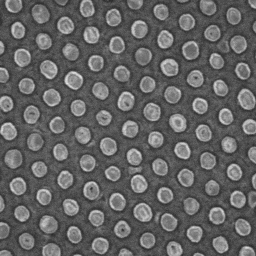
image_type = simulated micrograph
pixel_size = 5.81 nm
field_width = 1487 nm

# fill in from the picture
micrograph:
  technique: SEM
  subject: a regular array of raised bodies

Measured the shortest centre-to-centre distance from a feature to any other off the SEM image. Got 27.2 px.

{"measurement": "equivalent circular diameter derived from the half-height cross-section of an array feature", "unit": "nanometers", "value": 89.7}